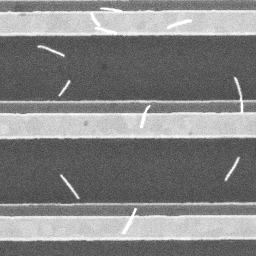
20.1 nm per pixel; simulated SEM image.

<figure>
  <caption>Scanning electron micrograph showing lines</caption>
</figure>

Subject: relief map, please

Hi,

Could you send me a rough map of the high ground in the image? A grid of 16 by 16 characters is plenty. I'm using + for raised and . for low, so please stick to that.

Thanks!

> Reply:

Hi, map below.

++++++++++++++++
++++++++++++++++
................
................
................
................
++++++++++++++++
++++++++++++++++
++++++++++++++.+
................
................
................
................
++++++++++++++++
++++++++++++++++
................